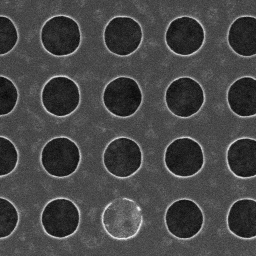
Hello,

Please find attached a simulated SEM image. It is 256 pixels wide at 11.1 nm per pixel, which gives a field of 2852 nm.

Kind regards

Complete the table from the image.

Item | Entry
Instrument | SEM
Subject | a regular array of holes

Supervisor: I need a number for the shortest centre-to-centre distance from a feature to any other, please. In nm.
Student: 675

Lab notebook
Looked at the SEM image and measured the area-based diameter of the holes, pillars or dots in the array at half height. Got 433 nanometers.